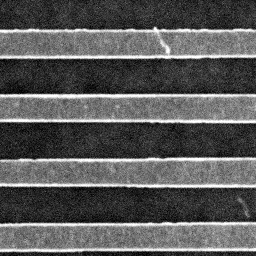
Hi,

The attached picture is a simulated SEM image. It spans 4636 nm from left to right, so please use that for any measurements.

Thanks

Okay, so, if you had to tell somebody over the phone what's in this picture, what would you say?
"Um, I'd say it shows lines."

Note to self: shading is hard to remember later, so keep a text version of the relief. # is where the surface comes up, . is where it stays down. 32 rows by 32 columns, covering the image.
................................
................................
................................
................................
################################
################################
################################
................................
................................
................................
................................
................................
################################
################################
################################
................................
................................
................................
................................
................................
################################
################################
################################
................................
................................
................................
................................
................................
################################
################################
################################
................................